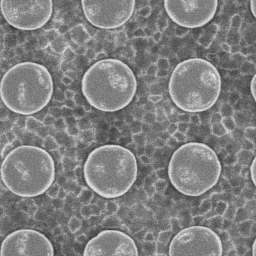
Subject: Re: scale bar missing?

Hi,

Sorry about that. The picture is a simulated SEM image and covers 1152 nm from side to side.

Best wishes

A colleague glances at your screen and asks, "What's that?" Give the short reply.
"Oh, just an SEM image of raised bodies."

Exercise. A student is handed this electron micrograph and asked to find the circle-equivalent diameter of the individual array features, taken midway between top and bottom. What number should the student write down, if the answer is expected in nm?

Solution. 234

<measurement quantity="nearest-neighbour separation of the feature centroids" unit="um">0.375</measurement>